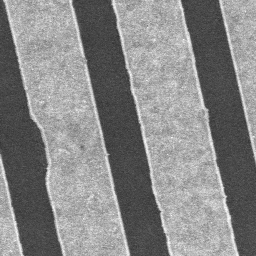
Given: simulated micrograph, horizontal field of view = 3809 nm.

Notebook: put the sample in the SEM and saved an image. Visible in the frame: one or a few lines or trenches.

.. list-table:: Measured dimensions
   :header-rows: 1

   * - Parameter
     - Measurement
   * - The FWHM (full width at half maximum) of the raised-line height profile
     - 938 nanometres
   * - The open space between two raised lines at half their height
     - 606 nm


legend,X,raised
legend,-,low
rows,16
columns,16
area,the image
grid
XXXXX--XXXX---XX
-XXXX--XXXXX--XX
-XXXX---XXXX--XX
-XXXX---XXXX---X
-XXXX---XXXX---X
--XXXX--XXXX---X
--XXXX---XXXX--X
--XXXX---XXXX--X
---XXX---XXXX---
---XXXX--XXXX---
---XXXX--XXXXX--
---XXXX---XXXX--
X--XXXX---XXXX--
X--XXXX---XXXX--
X---XXXX--XXXX--
X---XXXX---XXXX-